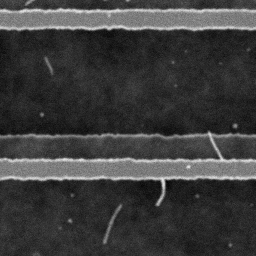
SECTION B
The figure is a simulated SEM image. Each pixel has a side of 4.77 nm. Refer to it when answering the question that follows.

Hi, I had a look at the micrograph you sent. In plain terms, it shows lines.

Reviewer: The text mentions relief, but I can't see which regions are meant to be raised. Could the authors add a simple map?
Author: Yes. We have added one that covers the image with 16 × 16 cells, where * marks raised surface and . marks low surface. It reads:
****************
****************
................
................
................
................
................
................
.*********.*****
****************
****************
................
................
................
................
................